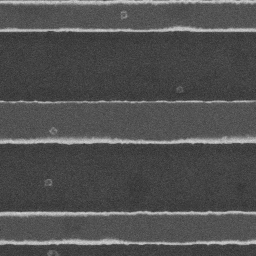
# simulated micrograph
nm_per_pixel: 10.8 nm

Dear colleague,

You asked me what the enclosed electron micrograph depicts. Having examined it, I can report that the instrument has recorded lines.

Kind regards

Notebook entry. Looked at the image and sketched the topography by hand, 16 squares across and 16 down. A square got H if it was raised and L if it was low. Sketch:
HHHHHHHHHHHHHHHH
HHHHHHHHHHHHHHHH
LLLLLLLLLLLLLLLL
LLLLLLLLLLLLLLLL
LLLLLLLLLLLLLLLL
LLLLLLLLLLLLLLLL
HHHHHHHHHHHHHHHH
HHHHHHHHHHHHHHHH
HHHHHHHHHHHHHHHH
LLLLLLLLLLLLLLLL
LLLLLLLLLLLLLLLL
LLLLLLLLLLLLLLLL
LLLLLLLLLLLLLLLL
HHHHHHHHHHHHHHHH
HHHHHHHHHHHHHHHH
LLLLLLLLLLLLLLLL